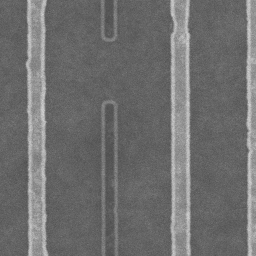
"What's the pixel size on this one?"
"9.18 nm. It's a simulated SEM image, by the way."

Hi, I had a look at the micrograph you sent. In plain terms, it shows one or a few lines or trenches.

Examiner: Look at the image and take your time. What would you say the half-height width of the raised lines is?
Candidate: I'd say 126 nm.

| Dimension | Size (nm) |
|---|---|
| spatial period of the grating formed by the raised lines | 661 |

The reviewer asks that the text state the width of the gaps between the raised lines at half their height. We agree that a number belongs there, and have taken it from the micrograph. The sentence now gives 549 nanometres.